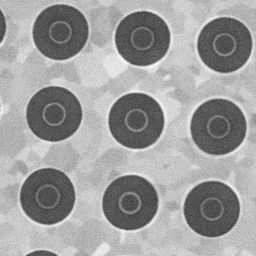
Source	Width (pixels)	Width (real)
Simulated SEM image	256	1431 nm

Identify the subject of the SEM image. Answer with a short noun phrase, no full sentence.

an array of small figures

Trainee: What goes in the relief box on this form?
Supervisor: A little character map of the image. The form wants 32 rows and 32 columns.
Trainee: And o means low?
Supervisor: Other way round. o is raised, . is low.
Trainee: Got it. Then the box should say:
ooooooo.oooooooooooooooooooooooo
ooooo.....ooooooo..ooooooooooooo
.ooo.......oooo......ooooo....oo
.ooo..ooo..ooo...o...oooo......o
.ooo..ooo..ooo..ooo..oooo..oo..o
oooo.......ooo...oo..ooo...oo...
ooooo.....ooooo......oooo..oo...
ooooooo.ooooooo.....ooooo......o
oooooooooooooooooooooooooo....oo
oooooooooooooooooooooooooooooooo
oooooooooooooooooooooooooooooooo
ooooo....oooooooo.oooooooooooooo
oooo......ooooo.....oooooo...ooo
ooo...oo..oooo......oooo......oo
ooo..ooo..oooo..oo...ooo.......o
ooo...o...ooo...oo...ooo..ooo..o
oooo.....ooooo......oooo..oo...o
ooooo...oooooo......oooo.......o
oooooooooooooooo..ooooooo.....oo
oooooooooooooooooooooooooo..oooo
oooooooooooooooooooooooooooooooo
oooo....oooooooooooooooooooooooo
ooo......ooooo.....ooooooo.ooooo
ooo..oo..oooo.......oooo.....ooo
oo...oo..oooo..oo...ooo.......oo
oo...oo..oooo..oo...ooo..ooo..oo
ooo......oooo...o...ooo..ooo..oo
oooo....ooooo......oooo.......oo
oooooooooooooo....oooooo.....ooo
ooooooooooooooooooooooooo...oooo
oooooooooooooooooooooooooooooooo
oooo...ooooooooooooooooooooooooo